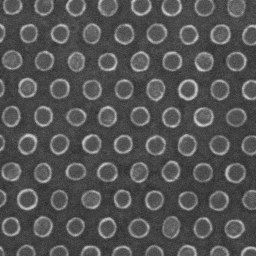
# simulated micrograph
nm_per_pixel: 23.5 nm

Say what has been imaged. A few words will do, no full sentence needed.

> a regular array of raised bodies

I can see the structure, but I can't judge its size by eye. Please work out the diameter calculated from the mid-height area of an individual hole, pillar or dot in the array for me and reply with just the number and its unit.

430 nm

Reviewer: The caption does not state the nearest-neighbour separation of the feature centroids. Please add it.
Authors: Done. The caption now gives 735 nm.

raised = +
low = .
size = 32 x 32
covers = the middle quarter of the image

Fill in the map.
.++++....++++....++++....++++...
..++..............++......++....
................................
................................
+.....++......++.....++++.....++
+....++++....++++....++++....+++
+....++++....++++....++++....+++
+....++++....++++....++++....+++
......++......++......++......++
................................
................................
..++......++......++......++....
.++++....++++....++++....++++...
.++++....++++....++++....++++...
.++++....++++....++++....++++...
..........++..............++....
................................
................................
+.....+++.....++......++.....+++
+....++++....++++....++++....+++
+....++++....++++....++++....+++
......+++....+++.....++++....+++
......................++......++
................................
................................
.++++....++++....+++.....++++...
.++++....++++....++++....++++...
.++++....++++....++++....++++...
..++.....++++....++++....+++....
................................
................................
................................